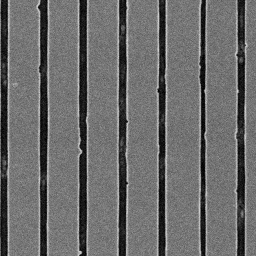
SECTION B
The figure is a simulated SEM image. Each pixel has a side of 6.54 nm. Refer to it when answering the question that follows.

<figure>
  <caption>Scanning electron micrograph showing parallel lines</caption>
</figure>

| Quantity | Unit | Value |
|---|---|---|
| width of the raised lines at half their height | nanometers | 208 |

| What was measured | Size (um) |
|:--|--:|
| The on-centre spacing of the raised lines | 0.258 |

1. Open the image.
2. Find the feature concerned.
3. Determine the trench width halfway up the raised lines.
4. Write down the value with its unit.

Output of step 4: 51.5 nm